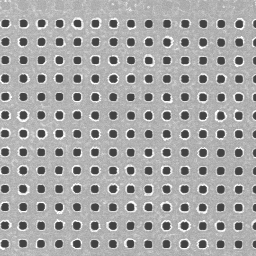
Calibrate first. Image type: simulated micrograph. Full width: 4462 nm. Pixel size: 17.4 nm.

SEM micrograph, a regular array of holes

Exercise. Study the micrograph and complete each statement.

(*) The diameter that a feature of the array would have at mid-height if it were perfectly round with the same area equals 145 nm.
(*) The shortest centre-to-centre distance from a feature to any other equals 17.8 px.